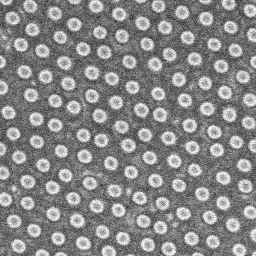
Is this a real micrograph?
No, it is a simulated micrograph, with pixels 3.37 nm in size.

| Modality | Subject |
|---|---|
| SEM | a regular array of raised bodies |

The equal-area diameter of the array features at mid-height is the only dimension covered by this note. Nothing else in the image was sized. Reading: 40.6 nanometers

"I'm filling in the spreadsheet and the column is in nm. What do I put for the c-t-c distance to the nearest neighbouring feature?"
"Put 72.3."